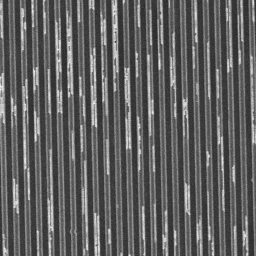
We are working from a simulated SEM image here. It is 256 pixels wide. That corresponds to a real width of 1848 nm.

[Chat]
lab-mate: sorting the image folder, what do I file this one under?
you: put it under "parallel lines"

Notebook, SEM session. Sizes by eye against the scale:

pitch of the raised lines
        82.5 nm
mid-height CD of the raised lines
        0.0424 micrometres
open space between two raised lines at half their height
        42.4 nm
